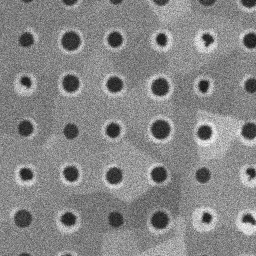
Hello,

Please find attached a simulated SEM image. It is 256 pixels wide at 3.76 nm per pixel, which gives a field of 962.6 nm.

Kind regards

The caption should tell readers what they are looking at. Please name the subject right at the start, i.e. a regular array of holes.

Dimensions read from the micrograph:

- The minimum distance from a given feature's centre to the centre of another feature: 43.6 pixels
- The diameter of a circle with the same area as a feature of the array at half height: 0.0622 um